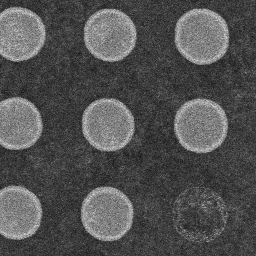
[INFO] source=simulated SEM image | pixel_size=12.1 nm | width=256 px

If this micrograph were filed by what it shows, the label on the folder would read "raised bodies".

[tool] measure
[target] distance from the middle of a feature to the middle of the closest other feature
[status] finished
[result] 89.5 px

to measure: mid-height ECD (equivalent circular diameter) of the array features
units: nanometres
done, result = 612